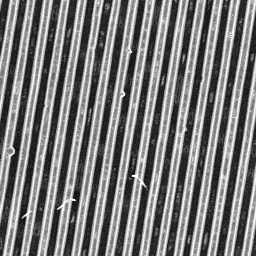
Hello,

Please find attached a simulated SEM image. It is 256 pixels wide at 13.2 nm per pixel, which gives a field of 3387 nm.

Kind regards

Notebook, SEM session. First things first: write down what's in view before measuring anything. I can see parallel lines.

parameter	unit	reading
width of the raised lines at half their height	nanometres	106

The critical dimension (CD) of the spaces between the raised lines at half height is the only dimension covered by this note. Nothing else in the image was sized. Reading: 119 nm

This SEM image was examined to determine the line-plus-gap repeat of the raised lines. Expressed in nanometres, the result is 222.